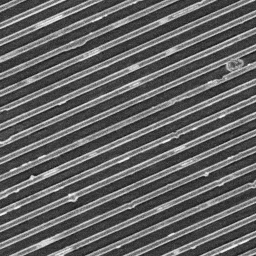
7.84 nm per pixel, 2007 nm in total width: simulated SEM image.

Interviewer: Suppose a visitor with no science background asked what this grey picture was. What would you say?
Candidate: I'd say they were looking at parallel lines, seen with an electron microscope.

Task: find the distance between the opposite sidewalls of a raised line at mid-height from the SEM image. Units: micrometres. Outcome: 0.0412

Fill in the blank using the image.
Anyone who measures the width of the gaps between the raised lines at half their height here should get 82.4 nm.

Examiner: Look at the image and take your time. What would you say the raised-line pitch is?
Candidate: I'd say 121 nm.